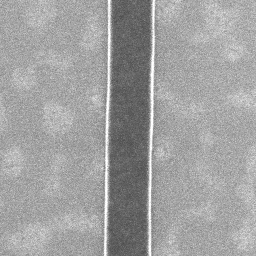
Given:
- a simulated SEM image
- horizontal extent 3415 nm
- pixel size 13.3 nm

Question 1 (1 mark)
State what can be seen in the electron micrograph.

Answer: one or a few lines or trenches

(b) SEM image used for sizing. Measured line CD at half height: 598 nanometers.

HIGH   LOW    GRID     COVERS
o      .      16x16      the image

.......ooo......
.......ooo......
.......ooo......
.......ooo......
.......ooo......
.......ooo......
.......ooo......
.......oo.......
.......oo.......
.......oo.......
.......oo.......
.......oo.......
.......oo.......
.......oo.......
.......oo.......
.......oo.......